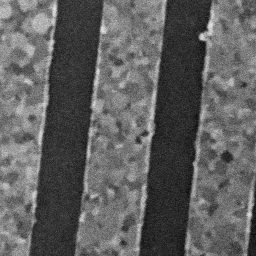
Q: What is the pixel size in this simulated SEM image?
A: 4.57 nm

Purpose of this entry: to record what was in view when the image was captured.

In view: one or a few lines or trenches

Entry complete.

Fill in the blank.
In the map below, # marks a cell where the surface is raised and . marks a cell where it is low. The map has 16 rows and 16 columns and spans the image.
####..####...###
###...####...###
###...####...###
###...####...###
###...####...###
###...####...###
###...####...###
###...####..####
###...####..####
###..####...####
##...####...####
##...####...####
##...####...####
##...####...####
##...####...####
##...####...###.